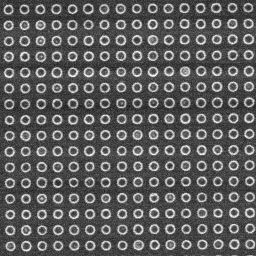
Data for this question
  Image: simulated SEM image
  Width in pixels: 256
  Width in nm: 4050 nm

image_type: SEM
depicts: a regular array of raised bodies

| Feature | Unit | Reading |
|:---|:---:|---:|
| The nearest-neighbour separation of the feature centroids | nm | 247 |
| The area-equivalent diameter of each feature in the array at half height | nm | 138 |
